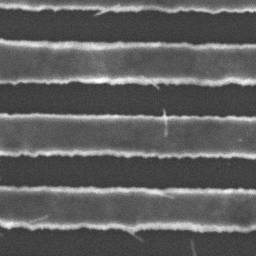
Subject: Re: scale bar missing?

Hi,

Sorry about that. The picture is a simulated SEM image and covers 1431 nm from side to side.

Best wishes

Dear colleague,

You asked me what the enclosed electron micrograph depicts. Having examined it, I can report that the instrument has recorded lines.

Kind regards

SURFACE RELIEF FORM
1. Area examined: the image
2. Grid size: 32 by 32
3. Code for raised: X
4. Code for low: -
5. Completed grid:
XXXXXXXXXXXXXXXXXXXXXXXXXXXXXXXX
---------------------X----XX-XXX
--------------------------------
--------------------------------
--------------------------------
XXXXXXXXXX-XX-XXXXXXXXX---------
XXXXXXXXXXXXXXXXXXXXXXXXXXXXXXXX
XXXXXXXXXXXXXXXXXXXXXXXXXXXXXXXX
XXXXXXXXXXXXXXXXXXXXXXXXXXXXXXXX
XXXXXXXXXXXXXXXXXXXXXXXXXXXXXXXX
-------------------------XXX----
--------------------------------
--------------------------------
--------------------------------
XXXXXXXXXXXXXXX--X--------------
XXXXXXXXXXXXXXXXXXXXXXXXXXXXXXXX
XXXXXXXXXXXXXXXXXXXXXXXXXXXXXXXX
XXXXXXXXXXXXXXXXXXXXXXXXXXXXXXXX
XXXXXXXXXXXXXXXXXXXXXXXXXXXXXXXX
------------------XXXXXXXXXXXXXX
--------------------------------
--------------------------------
--------------------------------
XX-XXXXX------------------------
XXXXXXXXXXXXXXXXXXXXXXXXXXXXXXXX
XXXXXXXXXXXXXXXXXXXXXXXXXXXXXXXX
XXXXXXXXXXXXXXXXXXXXXXXXXXXXXXXX
XXXXXXXXXXXXXXXXXXXXXXXXXXXXXXXX
----X-XXXX-XXX-XXX-X-XXXXXXXXXXX
--------------------------------
--------------------------------
--------------------------------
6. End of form